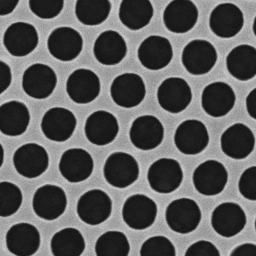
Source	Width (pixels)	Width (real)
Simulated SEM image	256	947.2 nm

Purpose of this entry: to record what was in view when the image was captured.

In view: a regular array of holes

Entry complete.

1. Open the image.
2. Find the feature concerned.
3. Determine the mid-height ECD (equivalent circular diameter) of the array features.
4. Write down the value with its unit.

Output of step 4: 0.129 um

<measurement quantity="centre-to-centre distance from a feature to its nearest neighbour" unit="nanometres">165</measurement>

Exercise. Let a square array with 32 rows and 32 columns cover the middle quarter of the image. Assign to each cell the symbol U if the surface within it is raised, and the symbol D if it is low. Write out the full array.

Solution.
UUUUUUUUUUUUUUUUUUUUDDDDDUUUUUDD
UUUDDDUUUUUUUUUUUUUUUUDUUUUUUUUD
UUDDDDDDUUUUUUUDDDUUUUUUUUUUUUUU
UDDDDDDDDUUUUDDDDDDUUUUUUUDDDUUU
UDDDDDDDDUUUDDDDDDDDUUUUUDDDDDDU
UDDDDDDDDUUUDDDDDDDDUUUUDDDDDDDU
UDDDDDDDDUUUDDDDDDDDUUUDDDDDDDDD
UDDDDDDDDUUUDDDDDDDDUUUDDDDDDDDD
UUDDDDDDUUUUDDDDDDDDUUUDDDDDDDDD
UUUDDDDUUUUUUDDDDDDUUUUUDDDDDDDD
UUUUUUUUUUUUUUDDDDUUUUUUDDDDDDDU
DUUUUUUUUUUUUUUUUUUUUUUUUDDDDDUU
DDUUUUUDDDDDUUUUUUUUUUUUUUUUUUUU
DDDUUUDDDDDDDUUUUUDDDDDUUUUUUUUU
DDDUUDDDDDDDDUUUUDDDDDDDUUUUUUDD
DDDUUDDDDDDDDDUUUDDDDDDDDUUUUDDD
DDDUUDDDDDDDDDUUDDDDDDDDDUUUDDDD
DDUUUDDDDDDDDUUUDDDDDDDDDUUUDDDD
DUUUUUDDDDDDDUUUDDDDDDDDDUUUDDDD
UUUUUUUDDDDDUUUUUDDDDDDDUUUUDDDD
UUUUUUUUUUUUUUUUUUDDDDDUUUUUDDDD
UDDDDUUUUUUUUUUUUUUUDUUUUUUUUDDD
DDDDDDUUUUUUDDDDUUUUUUUUUUUUUUDD
DDDDDDDUUUUDDDDDDDUUUUUUDDUUUUUU
DDDDDDDUUUDDDDDDDDUUUUUDDDDDUUUU
DDDDDDDUUUDDDDDDDDDUUUDDDDDDDUUU
DDDDDDDUUUDDDDDDDDDUUDDDDDDDDUUU
DDDDDDDUUUDDDDDDDDDUUDDDDDDDDDUU
DDDDDDUUUUDDDDDDDDUUUDDDDDDDDDUU
UDDDUUUUUUUDDDDDDUUUUDDDDDDDDUUU
UUUUUUUUUUUUDDDDUUUUUUDDDDDDDUUU
UUUUUUUDDUUUUUUUUUUUUUUDDDDDUUUU